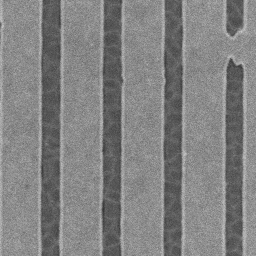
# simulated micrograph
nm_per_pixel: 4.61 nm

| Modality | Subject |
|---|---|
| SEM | one or a few lines or trenches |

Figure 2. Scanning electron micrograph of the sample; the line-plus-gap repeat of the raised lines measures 282 nanometers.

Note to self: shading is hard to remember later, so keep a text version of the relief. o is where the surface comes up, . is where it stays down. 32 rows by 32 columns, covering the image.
ooooo...ooooo..ooooo...ooooo...o
ooooo...ooooo..ooooo...ooooo...o
ooooo...ooooo..ooooo...ooooo...o
ooooo...ooooo..ooooo...ooooo...o
ooooo...ooooo..ooooo...ooooooooo
ooooo...ooooo..ooooo...ooooooooo
ooooo...ooooo..ooooo...ooooooooo
ooooo...ooooo..ooooo...ooooooooo
ooooo...ooooo..ooooo...ooooo..oo
ooooo...ooooo..ooooo...ooooo...o
ooooo...ooooo...oooo...ooooo...o
ooooo...ooooo..ooooo...ooooo...o
ooooo...ooooo..ooooo...ooooo...o
ooooo...ooooo..ooooo...ooooo...o
ooooo...ooooo..ooooo...ooooo...o
ooooo...ooooo..ooooo...ooooo...o
ooooo...ooooo..ooooo...ooooo...o
ooooo...ooooo..ooooo...ooooo...o
ooooo...ooooo..ooooo...ooooo...o
ooooo...ooooo..ooooo...ooooo...o
ooooo...ooooo..ooooo...ooooo...o
ooooo...ooooo..ooooo...ooooo...o
ooooo...ooooo..ooooo...ooooo...o
ooooo...ooooo..ooooo...ooooo...o
ooooo...ooooo..ooooo...ooooo...o
ooooo...ooooo..ooooo...ooooo...o
ooooo...oooooo.ooooo...ooooo..oo
ooooo...ooooo..ooooo...ooooo...o
ooooo...ooooo..ooooo...ooooo..oo
ooooo...ooooo..ooooo...ooooo...o
ooooo...ooooo..ooooo...ooooo..oo
ooooo...ooooo..ooooo...ooooo...o